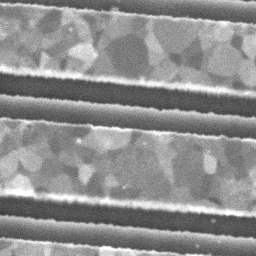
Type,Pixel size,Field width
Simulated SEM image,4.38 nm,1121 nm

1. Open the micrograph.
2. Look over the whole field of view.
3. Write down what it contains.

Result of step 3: lines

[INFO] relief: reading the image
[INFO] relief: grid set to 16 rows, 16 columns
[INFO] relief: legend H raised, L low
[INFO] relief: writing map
HHHHLLLLLLLLLLLL
HHHHHHHHHHHHHHHL
HHHHHHHHHHHHHHHH
HHHHHHHHHHHHHHHH
LHHHHHHHHHHHHHHH
LLLLLLLLLLLLHHHH
LLLLLLLLLLLLLLLL
HHLLLLLLLLLLLLLL
HHHHHHHHHHHHHLLL
HHHHHHHHHHHHHHHH
HHHHHHHHHHHHHHHH
HHHHHHHHHHHHHHHH
LLLLLHHHHHHHHHHH
LLLLLLLLLLLLLLLL
LLLLLLLLLLLLLLLL
HHHHHHHLLLLLLLLL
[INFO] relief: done